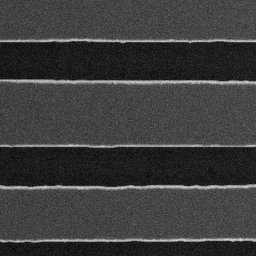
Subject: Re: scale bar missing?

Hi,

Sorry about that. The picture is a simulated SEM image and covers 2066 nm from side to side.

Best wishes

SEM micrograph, lines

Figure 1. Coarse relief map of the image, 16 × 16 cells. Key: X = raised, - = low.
XXXXXXXXXXXXXXXX
XXXXXXXXXXXXXXXX
XXXXXXXXXXXXXXXX
----------------
----------------
XXXXXXXXXXXXXXXX
XXXXXXXXXXXXXXXX
XXXXXXXXXXXXXXXX
XXXXXXXXXXXXXXXX
----------------
----------------
----------------
XXXXXXXXXXXXXXXX
XXXXXXXXXXXXXXXX
XXXXXXXXXXXXXXXX
----------------